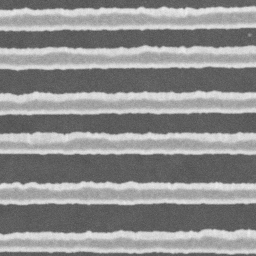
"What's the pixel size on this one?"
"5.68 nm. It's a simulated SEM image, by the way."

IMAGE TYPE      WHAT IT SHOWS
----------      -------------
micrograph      lines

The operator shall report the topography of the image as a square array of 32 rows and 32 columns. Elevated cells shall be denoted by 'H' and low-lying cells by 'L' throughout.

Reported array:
LLLLLLLLLLLLLLLLLLLLLLLLLLLLLLLL
LHHHHHHHHHHHHHHHHHHHHHHHHHHHHHHH
HHHHHHHHHHHHHHHHHHHHHHHHHHHHHHHH
HHHHHHHHHHHHHHHHHHHHHHHHHHHHHHLL
LLLLLLLLLLLLLLLLLLLLLLLLLLLLLLLL
LLLLLLLLLLLLLLLLLLLLLLLLLLLLLLLL
HHHHHHHHHHHHHHHHHHHHHHHHHHHHHHHH
HHHHHHHHHHHHHHHHHHHHHHHHHHHHHHHH
HHHHHHHHHHHLLLLLLLLLLLLLLLLLLLLL
LLLLLLLLLLLLLLLLLLLLLLLLLLLLLLLL
LLLLLLLLLLLLLLLLLLLLLLLLLLLLLLLL
LLLLLLLLLLLLLLLLLLLLLLLLLLLLLLLL
HHHHHHHHHHHHHHHHHHHHHHHHHHHHHHHH
HHHHHHHHHHHHHHHHHHHHHHHHHHHHHHHH
LLLLLLLLLLLLLLLLLLLLLLLLLLLLLLLL
LLLLLLLLLLLLLLLLLLLLLLLLLLLLLLLL
LLLLLLLLLLLLLLLLLLLLLLLLLLLLLLLL
HHHHHHHHHHHHHHHHHHHHHHHHHHHHHHHH
HHHHHHHHHHHHHHHHHHHHHHHHHHHHHHHH
LLLLLLLLLLLLLLLLLLLLLLLLLLLLLLLL
LLLLLLLLLLLLLLLLLLLLLLLLLLLLLLLL
LLLLLLLLLLLLLLLLLLLLLLLLLLLLLLLL
LLLLLLLLLLLLLLLLLLLLLLLLLLLLLLLL
HHHHHHHHHHHHHHHHHHHHHHHHHHHHHHHH
HHHHHHHHHHHHHHHHHHHHHHHHHHHHHHHH
LLHLLLLLLLLLLLLHHLLLLLLLLLLLLLLL
LLLLLLLLLLLLLLLLLLLLLLLLLLLLLLLL
LLLLLLLLLLLLLLLLLLLLLLLLLLLLLLLL
LLLLLLLLLLLLLLLLLLLLLLLLLLLLLLLL
HHHHHHHHHHHHHHHHHHHHHHHHHHHHHHHH
HHHHHHHHHHHHHHHHHHHHHHHHHHHHHHHH
LLLLLLLLLLLLHHHHHHHLLHHHHHHHHHHH